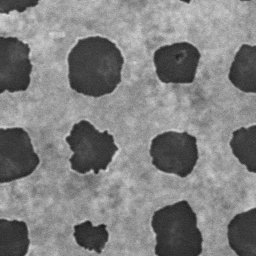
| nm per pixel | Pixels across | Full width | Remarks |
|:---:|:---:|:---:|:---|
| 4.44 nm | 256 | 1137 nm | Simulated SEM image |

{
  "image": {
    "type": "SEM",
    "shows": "holes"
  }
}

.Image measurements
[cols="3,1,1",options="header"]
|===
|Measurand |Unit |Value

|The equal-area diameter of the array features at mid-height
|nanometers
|221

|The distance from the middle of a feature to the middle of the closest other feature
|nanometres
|363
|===